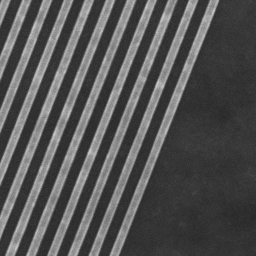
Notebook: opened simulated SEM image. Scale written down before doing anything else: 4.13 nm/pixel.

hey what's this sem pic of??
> parallel lines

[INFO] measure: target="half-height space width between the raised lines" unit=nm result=49.1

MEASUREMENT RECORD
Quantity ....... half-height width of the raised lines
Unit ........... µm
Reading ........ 0.0322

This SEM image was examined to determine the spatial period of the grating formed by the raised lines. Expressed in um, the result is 0.0802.